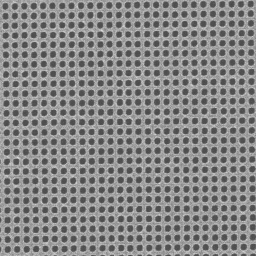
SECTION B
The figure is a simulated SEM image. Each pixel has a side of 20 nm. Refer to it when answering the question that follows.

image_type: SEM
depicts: a regular array of holes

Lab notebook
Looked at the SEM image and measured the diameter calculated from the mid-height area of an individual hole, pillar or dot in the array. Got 132 nanometers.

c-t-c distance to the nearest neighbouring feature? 185 nanometers